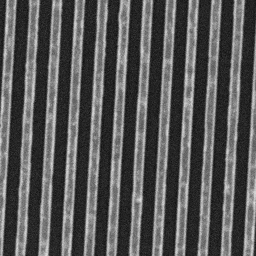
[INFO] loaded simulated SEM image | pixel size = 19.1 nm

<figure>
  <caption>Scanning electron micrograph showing parallel lines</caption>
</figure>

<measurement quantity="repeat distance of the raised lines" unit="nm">434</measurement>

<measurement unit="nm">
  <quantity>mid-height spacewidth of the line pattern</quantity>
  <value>293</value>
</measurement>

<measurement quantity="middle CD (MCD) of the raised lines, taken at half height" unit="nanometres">155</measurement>